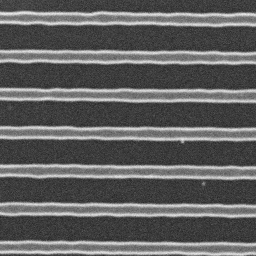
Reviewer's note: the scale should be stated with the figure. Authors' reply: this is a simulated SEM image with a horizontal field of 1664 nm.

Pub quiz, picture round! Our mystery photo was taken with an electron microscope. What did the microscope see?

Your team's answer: groups of lines, slits or small figures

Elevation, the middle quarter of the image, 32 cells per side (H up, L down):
LLLLLLLLLLLLLLLLLLLLLLLLLLLLLLLL
LLLLLLLLLLLLLLLLLLLLLLLLLLLLLLLL
LLLLLLLLLLLLLLLLLLLLLLLLLLLLLLLL
LLLLLLLLLLLLLLLLLLLLLLLLLLLLLLLL
LLLLLLLLLLLLLLLLLLLLLLLLLLLLLLLL
LLLLLLLLLLLLLLLLLLLLLLLLLLLLLLLL
HHHHHHHLLLLLLLHHHLLLLLLLLLLLLLLL
HHHHHHHHHHHHHHHHHHHHHHHHHHHHHHHH
HHHHHHHHHHHHHHHHHHHHHHHHHHHHHHHH
LLLLLLLLLLLLLLLLLLLLLLLLLLLLLLLL
LLLLLLLLLLLLLLLLLLLLLLLLLLLLLLLL
LLLLLLLLLLLLLLLLLLLLLLLLLLLLLLLL
LLLLLLLLLLLLLLLLLLLLLLLLLLLLLLLL
LLLLLLLLLLLLLLLLLLLLLLLLLLLLLLLL
LLLLLLLLLLLLLLLLLLLLLLLLLLLLLLLL
LLLLLLLLLLLLLLLLLLLLLLLLLLLLLLLL
HHHHHHHHHHHHHHHHHHHHHHHHHHHHHHHH
HHHHHHHHHHHHHHHHHHHHHHHHHHHHHHHH
LLLLLLLLLHHHHHHHHHHHHHHHHHHHHHHH
LLLLLLLLLLLLLLLLLLLLLLLLLLLLLLLL
LLLLLLLLLLLLLLLLLLLLLLLLLLLLLLLL
LLLLLLLLLLLLLLLLLLLLLLLLLLLLLLLL
LLLLLLLLLLLLLLLLLLLLLLLLLLLLLLLL
LLLLLLLLLLLLLLLLLLLLLLLLLLLLLLLL
LLLLLLLLLLLLLLLLLLLLLLLLLLLLLLLL
HHHHLLLLLLLLLLLLLLLLLLLLLLLLLLLL
HHHHHHHHHHHHHHHHHHHHHHHHHHHHHHHH
HHHHHHHHHHHHHHHHHHHHHHHHHHHHHHHH
LLLLLLLLLLLLLLLLLLLLLLLLLLLLLLLL
LLLLLLLLLLLLLLLLLLLLLLLLLLLLLLLL
LLLLLLLLLLLLLLLLLLLLLLLLLLLLLLLL
LLLLLLLLLLLLLLLLLLLLLLLLLLLLLLLL